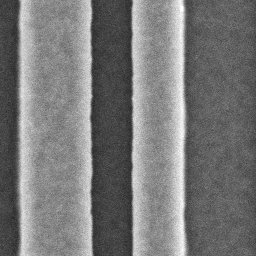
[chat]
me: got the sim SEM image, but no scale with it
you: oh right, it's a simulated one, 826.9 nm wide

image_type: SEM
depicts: lines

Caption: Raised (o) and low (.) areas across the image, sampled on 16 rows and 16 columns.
.ooooo..ooo.....
.ooooo..ooo.....
.ooooo..ooo.....
.ooooo..ooo.....
.ooooo..ooo.....
.ooooo..ooo.....
.ooooo..ooo.....
.ooooo..ooo.....
.ooooo..ooo.....
.ooooo..ooo.....
.ooooo..ooo.....
.ooooo..ooo.....
.ooooo..ooo.....
.ooooo..ooo.....
.ooooo..ooo.....
.ooooo..ooo.....